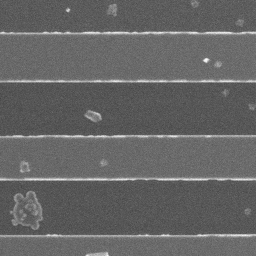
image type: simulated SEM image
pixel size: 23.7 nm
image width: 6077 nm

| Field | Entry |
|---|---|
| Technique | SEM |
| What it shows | lines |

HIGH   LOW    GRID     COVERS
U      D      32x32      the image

DDDDDDDDDDDDDDDDDDDDDDDDDDDDDDDD
DDDDDDDDDDDDDDDDDDDDDDDDDDDDDDDD
DDDDDDDDDDDDDDDDDDDDDDDDDDDDDDDD
DDDDDDDDDDDDDDDDDDDDDDDDDDDDDDDD
UUUUUUUUUUUUUUUUUUUUUUUUUUUUUUUU
UUUUUUUUUUUUUUUUUUUUUUUUUUUUUUUU
UUUUUUUUUUUUUUUUUUUUUUUUUUUUUUUU
UUUUUUUUUUUUUUUUUUUUUUUUUUUUUUUU
UUUUUUUUUUUUUUUUUUUUUUUUUUUUUUUU
UUUUUUUUUUUUUUUUUUUUUUUUUUUUUUUU
DDDDDDDDDDDDDDDDDDDDDDDDDDDDDDDD
DDDDDDDDDDDDDDDDDDDDDDDDDDDDDDDD
DDDDDDDDDDDDDDDDDDDDDDDDDDDDDDDD
DDDDDDDDDDDDDDDDDDDDDDDDDDDDDDDD
DDDDDDDDDDDDDDDDDDDDDDDDDDDDDDDD
DDDDDDDDDDDDDDDDDDDDDDDDDDDDDDDD
DDDDDDDDDDDDDDDDDDDDDDDDDDDDDDDD
UUUUUUUUUUUUUUUUUUUUUUUUUUUUUUUU
UUUUUUUUUUUUUUUUUUUUUUUUUUUUUUUU
UUUUUUUUUUUUUUUUUUUUUUUUUUUUUUUU
UUUUUUUUUUUUUUUUUUUUUUUUUUUUUUUU
UUUUUUUUUUUUUUUUUUUUUUUUUUUUUUUU
DDDDDDDDDDDDDDDDDDDDDDDDDDDDDDDD
DDDDDDDDDDDDDDDDDDDDDDDDDDDDDDDD
DDDDDDDDDDDDDDDDDDDDDDDDDDDDDDDD
DDDDDDDDDDDDDDDDDDDDDDDDDDDDDDDD
DDDDDDDDDDDDDDDDDDDDDDDDDDDDDDDD
DDDDDDDDDDDDDDDDDDDDDDDDDDDDDDDD
DDDDDDDDDDDDDDDDDDDDDDDDDDDDDDDD
UUUUUUUUUUUUUUUUUUUUUUUUUUUUUUUU
UUUUUUUUUUUUUUUUUUUUUUUUUUUUUUUU
UUUUUUUUUUUUUUUUUUUUUUUUUUUUUUUU